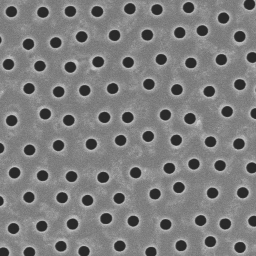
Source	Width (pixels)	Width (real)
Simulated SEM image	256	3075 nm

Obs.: a regular array of holes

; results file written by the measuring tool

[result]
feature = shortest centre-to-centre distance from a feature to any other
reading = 0.318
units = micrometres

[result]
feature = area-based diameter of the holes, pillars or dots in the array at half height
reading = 138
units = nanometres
